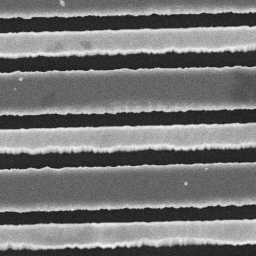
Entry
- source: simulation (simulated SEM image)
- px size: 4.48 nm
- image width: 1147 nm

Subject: lines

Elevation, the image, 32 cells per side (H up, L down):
HHHHHHHHHHHHHHHHHHHHHHHHHHHHHHHH
HHHHHHHHHHHHHHHHHHHHHHHHHLHLLHHL
LLLLLLLLLLLLLLLLLLLLLLLLLLLLLLLL
LLLLLLLLLLLLLLLLLLLLLLLLLLLHHHHH
HHHHHHHHHHHHHHHHHHHHHHHHHHHHHHHH
HHHHHHHHHHHHHHHHHHHHHHHHHHHHHHHH
HHHHHHHHHHHHHHHHHLHHLLLLLLLLLLLL
LLLLLLLLLLLLLLLLLLLLLLLLLLLLLLLL
LLLLLLLLLLLLLLLLLLLHLLHHHHHHHHHH
HHHHHHHHHHHHHHHHHHHHHHHHHHHHHHHH
HHHHHHHHHHHHHHHHHHHHHHHHHHHHHHHH
HHHHHHHHHHHHHHHHHHHHHHHHHHHHHHHH
HHHHHHHHHHHHHHHHHHHHHHHHHHHHHHHH
HHHHHHHHHHHHHHHHHHHHHHHHHHHHHHHL
LLLLLLLLLLLLLLLLLLLLLLLLLLLLLLLL
LLLLLLLLLLLLLLLLLLLLLLLLLLLLLHLH
HHHHHHHHHHHHHHHHHHHHHHHHHHHHHHHH
HHHHHHHHHHHHHHHHHHHHHHHHHHHHHHHH
HHHHHHHHHHHHHHHHHHLHLHHHHLLLLLLL
LLLLLLLLLLLLLLLLLLLLLLLLLLLLLLLL
LLLLLLLLLLLLLLLLLLLLLLLLLLLHHHHH
HHHHHHHHHHHHHHHHHHHHHHHHHHHHHHHH
HHHHHHHHHHHHHHHHHHHHHHHHHHHHHHHH
HHHHHHHHHHHHHHHHHHHHHHHHHHHHHHHH
HHHHHHHHHHHHHHHHHHHHHHHHHHHHHHHH
HHHHHHHHHHHHHHHHHHHHHHHHHHHHHHHL
LLLLLLLLLLLLLLLLLLLLLLLLLLLLLLLL
LLLLLLLLLLLLLLLLLLLLLLLLLLLLLLLL
HHHHHHHHHHHHHHHHHHHHHHHHHHHHHHHH
HHHHHHHHHHHHHHHHHHHHHHHHHHHHHHHH
HHHHHHHHHHHHHHHHHHHHHLLLLLLHHHHL
LLLLLLLLLLLLLLLLLLLLLLLLLLLLLLLL